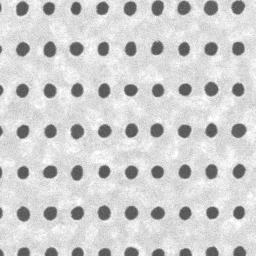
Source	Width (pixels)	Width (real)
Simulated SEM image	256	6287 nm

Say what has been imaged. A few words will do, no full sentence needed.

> a regular array of holes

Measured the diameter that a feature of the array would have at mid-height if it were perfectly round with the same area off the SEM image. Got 14.1 pixels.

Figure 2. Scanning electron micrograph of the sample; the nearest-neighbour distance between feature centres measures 659 nanometers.